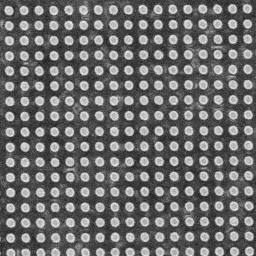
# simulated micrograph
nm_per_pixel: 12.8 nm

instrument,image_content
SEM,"a regular array of raised bodies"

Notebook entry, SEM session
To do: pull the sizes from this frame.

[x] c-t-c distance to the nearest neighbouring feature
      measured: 190 nanometres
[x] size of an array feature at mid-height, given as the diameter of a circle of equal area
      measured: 106 nm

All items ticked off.